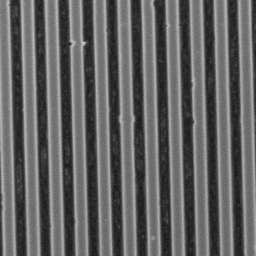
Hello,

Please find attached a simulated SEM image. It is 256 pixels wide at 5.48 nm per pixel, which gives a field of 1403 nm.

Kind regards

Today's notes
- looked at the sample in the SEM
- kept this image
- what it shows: parallel lines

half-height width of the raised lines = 0.0678 um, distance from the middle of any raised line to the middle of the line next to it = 132 nm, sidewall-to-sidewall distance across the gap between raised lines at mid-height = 0.0624 micrometres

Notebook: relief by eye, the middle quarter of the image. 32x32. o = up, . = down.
..ooo...ooo...ooo...ooo...ooo...
..ooo...ooo...ooo...ooo...ooo...
..ooo...ooo...ooo...ooo...ooo...
..ooo...ooo...ooo...ooo...ooo...
..ooo...ooo...ooo...ooo...ooo...
..ooo...ooo...ooo...ooo...ooo...
..ooo...ooo...ooo...ooo...ooo...
..ooo...ooo...ooo...ooo...ooo...
..ooo...ooo...ooo...ooo...ooo...
..ooo...ooo...ooo...ooo...ooo...
..ooo...ooo...ooo...ooo...ooo...
..ooo...ooo...ooo...ooo...ooo...
..ooo...ooo...ooo...ooo...ooo...
..ooo...ooo...ooo...ooo...ooo...
..ooo...ooo...ooo...ooo...ooo...
..ooo...ooo...ooo...ooo...ooo...
..ooo...ooo...ooo...ooo...ooo...
..ooo...ooo...ooo...ooo...ooo...
..ooo...ooo...ooo...ooo...ooo...
..ooo...ooo...ooo....oo...ooo...
..ooo...ooo...ooo....oo...ooo...
..ooo...ooo...ooo....oo....oo...
..ooo....oo...ooo....oo....oo...
..ooo....oo...ooo....oo....oo...
..ooo....oo...ooo....ooo...oo...
..ooo....oo....oo....ooo...oo...
..ooo....oo....oo....ooo...oo...
..ooo....oo....ooo...ooo...ooo..
..ooo....ooo...ooo...ooo...ooo..
...oo....ooo...oo....ooo...ooo..
...oo....ooo...oo....ooo...ooo..
...oo....ooo...ooo...ooo...ooo..